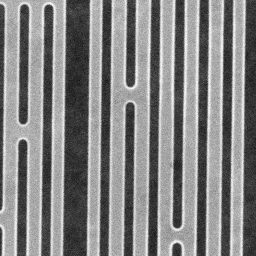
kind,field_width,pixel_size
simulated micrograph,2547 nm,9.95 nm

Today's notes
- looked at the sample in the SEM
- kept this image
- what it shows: groups of lines, slits or small figures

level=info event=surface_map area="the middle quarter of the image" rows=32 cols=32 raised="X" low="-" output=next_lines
------XXX---XXX---XXX---XXX---XX
------XXX---XXX---XXX---XXX---XX
------XXX---XXX---XXX---XXX---XX
------XXX---XXX---XXX---XXX---XX
------XXX---XXX---XXX---XXX---XX
------XXX---XXXX--XXX---XXX---XX
------XXX---XXXXXXXXX---XXX---XX
------XXX---XXXXXXXXX---XXX---XX
------XXX---XXXXXXXXX---XXX---XX
------XXX---XXXX-XXXX---XXX---XX
------XXX---XXX---XXX---XXX---XX
------XXX---XXX---XXX---XXX---XX
------XXX---XXX---XXX---XXX---XX
------XXX---XXX---XXX---XXX---XX
------XXX---XXX---XXX---XXX---XX
------XXX---XXX---XXX---XXX---XX
------XXX---XXX---XXX---XXX---XX
------XXX---XXX---XXX---XXX---XX
------XXX---XXX---XXX---XXX---XX
------XXX---XXX---XXX---XXX---XX
------XXX---XXX---XXX---XXX---XX
------XXX---XXX---XXX---XXX---XX
------XXX---XXX---XXX---XXX---XX
------XXX---XXX---XXX---XXX---XX
------XXX---XXX---XXX---XXX---XX
------XXX---XXX---XXX---XXX---XX
------XXX---XXX---XXX---XXX---XX
------XXX---XXX---XXX---XXX---XX
------XXX---XXX---XXX---XXX---XX
------XXX---XXX---XXX---XXX---XX
------XXX---XXX---XXX---XXX---XX
------XXX---XXX---XXX---XXX---XX